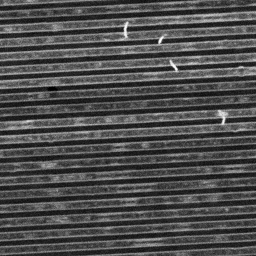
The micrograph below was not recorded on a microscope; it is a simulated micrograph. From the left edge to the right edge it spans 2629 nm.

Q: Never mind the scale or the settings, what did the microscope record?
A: parallel lines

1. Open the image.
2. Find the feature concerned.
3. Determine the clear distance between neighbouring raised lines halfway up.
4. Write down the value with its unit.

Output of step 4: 60.3 nanometers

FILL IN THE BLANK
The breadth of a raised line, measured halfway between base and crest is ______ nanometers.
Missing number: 85.9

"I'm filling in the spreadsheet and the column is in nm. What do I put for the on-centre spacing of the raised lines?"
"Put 142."